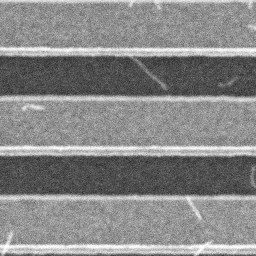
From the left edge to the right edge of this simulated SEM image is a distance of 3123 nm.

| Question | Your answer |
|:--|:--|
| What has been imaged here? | lines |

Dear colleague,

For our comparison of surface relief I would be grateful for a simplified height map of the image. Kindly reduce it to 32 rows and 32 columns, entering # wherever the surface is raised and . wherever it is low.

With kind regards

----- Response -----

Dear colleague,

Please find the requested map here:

################################
################################
################################
################################
################################
################################
################################
................................
................................
................................
................................
................................
#################.#####.#####...
################################
################################
################################
################################
################################
################################
................................
................................
................................
................................
................................
................................
################################
################################
################################
################################
################################
################################
###.############################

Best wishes